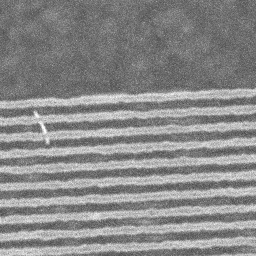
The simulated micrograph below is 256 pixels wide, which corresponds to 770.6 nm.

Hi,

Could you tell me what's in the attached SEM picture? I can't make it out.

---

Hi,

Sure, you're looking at parallel lines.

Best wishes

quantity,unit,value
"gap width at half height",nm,30.8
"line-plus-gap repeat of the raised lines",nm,49.5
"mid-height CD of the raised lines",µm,0.0199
